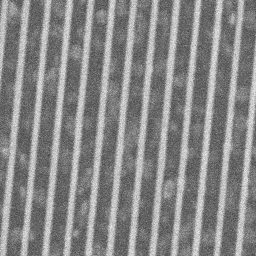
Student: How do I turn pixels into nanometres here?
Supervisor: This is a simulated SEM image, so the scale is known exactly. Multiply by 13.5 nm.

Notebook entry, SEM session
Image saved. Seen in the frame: parallel lines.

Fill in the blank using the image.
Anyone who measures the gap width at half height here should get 0.228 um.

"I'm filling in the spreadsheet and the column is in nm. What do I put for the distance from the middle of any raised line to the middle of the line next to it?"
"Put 289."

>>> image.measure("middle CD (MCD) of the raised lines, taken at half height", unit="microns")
0.0573